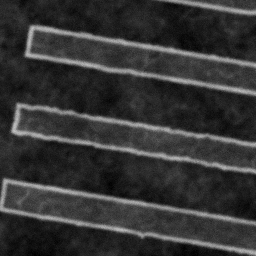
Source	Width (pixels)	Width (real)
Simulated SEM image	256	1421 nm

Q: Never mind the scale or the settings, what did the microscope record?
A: one or a few lines or trenches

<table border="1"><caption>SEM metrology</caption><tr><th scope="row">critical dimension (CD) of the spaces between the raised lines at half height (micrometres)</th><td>0.279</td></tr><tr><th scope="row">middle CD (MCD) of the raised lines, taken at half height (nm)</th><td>156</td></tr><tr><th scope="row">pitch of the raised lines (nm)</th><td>433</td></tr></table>